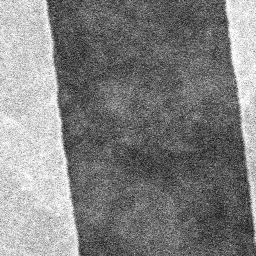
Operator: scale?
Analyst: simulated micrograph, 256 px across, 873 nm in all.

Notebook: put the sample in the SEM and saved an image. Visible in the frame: one or a few lines or trenches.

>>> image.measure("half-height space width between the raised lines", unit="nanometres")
615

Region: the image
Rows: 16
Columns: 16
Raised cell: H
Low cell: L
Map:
HHHLLLLLLLLLLLHH
HHHLLLLLLLLLLLHH
HHHLLLLLLLLLLLHH
HHHLLLLLLLLLLLLH
HHHLLLLLLLLLLLLH
HHHLLLLLLLLLLLLH
HHHHLLLLLLLLLLLH
HHHHLLLLLLLLLLLH
HHHHLLLLLLLLLLLH
HHHHLLLLLLLLLLLH
HHHHLLLLLLLLLLLL
HHHHLLLLLLLLLLLL
HHHHLLLLLLLLLLLL
HHHHHLLLLLLLLLLL
HHHHHLLLLLLLLLLL
HHHHHLLLLLLLLLLL